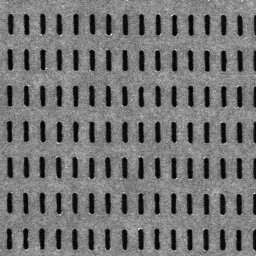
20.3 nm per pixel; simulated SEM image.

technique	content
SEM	a regular array of holes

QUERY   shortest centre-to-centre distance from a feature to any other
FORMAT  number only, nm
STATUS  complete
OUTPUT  330